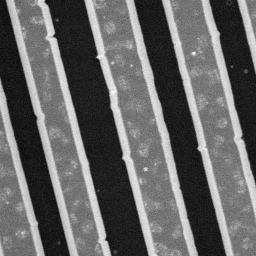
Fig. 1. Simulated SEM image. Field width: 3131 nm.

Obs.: one or a few lines or trenches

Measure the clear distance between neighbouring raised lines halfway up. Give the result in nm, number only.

430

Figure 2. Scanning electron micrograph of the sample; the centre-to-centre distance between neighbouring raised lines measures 951 nanometers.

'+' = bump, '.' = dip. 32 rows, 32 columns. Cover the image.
.++++......+++++.....+++++....++
..++++.....++++++....+++++.....+
..++++......+++++....+++++.....+
..++++......+++++.....+++++....+
..++++......+++++.....+++++....+
...++++.....++++++....+++++.....
...++++......+++++....+++++.....
...++++......+++++.....+++++....
...++++......+++++.....+++++....
....++++.....++++++....+++++....
....++++......+++++....+++++....
....++++......+++++.....+++++...
....++++......+++++.....+++++...
.....++++.....++++++....+++++...
+....++++......+++++....+++++...
+....++++......+++++.....++++...
+....+++++.....+++++.....+++++..
+.....++++.....++++++....+++++..
++....++++......+++++....+++++..
++....++++......+++++.....++++..
++....+++++.....+++++.....+++++.
++.....++++......+++++....+++++.
+++....++++......+++++....+++++.
+++....++++......+++++.....+++++
+++....+++++.....+++++.....+++++
++++....++++......++++.....+++++
++++....++++......+++++....+++++
++++....++++......+++++.....++++
++++....+++++.....+++++.....++++
+++++....++++......+++++....++++
+++++....++++......+++++....++++
+++++....++++......+++++.....+++